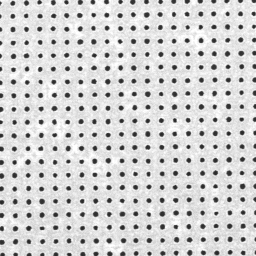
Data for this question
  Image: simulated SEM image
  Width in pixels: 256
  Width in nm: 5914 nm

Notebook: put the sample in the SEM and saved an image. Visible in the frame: a regular array of holes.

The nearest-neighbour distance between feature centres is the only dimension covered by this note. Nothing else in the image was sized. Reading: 300 nm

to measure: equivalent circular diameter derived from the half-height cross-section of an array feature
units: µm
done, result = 0.13